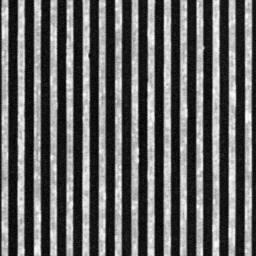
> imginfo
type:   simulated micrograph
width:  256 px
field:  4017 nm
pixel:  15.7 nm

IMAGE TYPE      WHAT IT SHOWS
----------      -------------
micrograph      parallel lines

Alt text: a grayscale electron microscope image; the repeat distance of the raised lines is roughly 255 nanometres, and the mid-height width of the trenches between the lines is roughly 157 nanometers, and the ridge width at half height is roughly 0.1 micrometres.